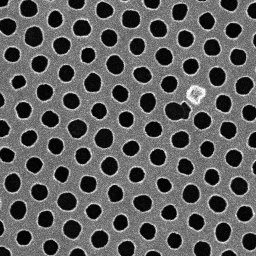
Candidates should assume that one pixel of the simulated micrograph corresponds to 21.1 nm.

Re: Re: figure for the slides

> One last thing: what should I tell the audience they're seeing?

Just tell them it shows a regular array of holes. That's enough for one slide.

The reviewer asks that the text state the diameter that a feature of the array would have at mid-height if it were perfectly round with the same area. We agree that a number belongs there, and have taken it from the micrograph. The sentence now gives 0.353 microns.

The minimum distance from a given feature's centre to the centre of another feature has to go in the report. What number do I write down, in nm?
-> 580